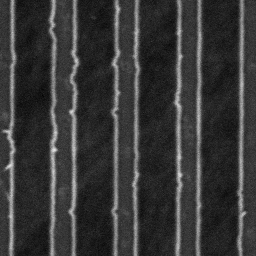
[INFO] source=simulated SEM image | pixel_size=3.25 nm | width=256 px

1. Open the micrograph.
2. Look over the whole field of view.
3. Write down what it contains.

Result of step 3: one or a few lines or trenches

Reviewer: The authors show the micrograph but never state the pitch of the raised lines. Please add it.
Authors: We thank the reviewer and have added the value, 0.203 microns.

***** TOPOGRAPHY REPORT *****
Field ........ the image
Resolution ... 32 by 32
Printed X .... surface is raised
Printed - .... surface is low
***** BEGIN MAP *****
-XXXXXX--XXXXXX--XXXXXX--XXXXX--
-XXXXXX--XXXXXX--XXXXXX--XXXXX--
-XXXXX---XXXXXX--XXXXX---XXXXX--
-XXXXX---XXXXXX--XXXXX---XXXXX--
--XXXXX--XXXXXX--XXXXX---XXXXX--
-XXXXXX--XXXXXX--XXXXX---XXXXX--
-XXXXXX--XXXXXX--XXXXX---XXXXX--
--XXXXX--XXXXXX--XXXXXX--XXXXX--
-XXXXXX--XXXXXX--XXXXX---XXXXX--
-XXXXXX--XXXXXX--XXXXX---XXXXX--
-XXXXXX--XXXXXX--XXXXX---XXXXX--
-XXXXXX--XXXXXX--XXXXX---XXXXX--
-XXXXXX--XXXXXX--XXXXX---XXXXX--
--XXXXX--XXXXX---XXXXX---XXXXX--
--XXXXX--XXXXX---XXXXX---XXXXX--
-XXXXXX--XXXXX---XXXXX---XXXXX--
-XXXXXX--XXXXXX--XXXXX---XXXXX--
-XXXXXX--XXXXXX--XXXXX---XXXXX--
--XXXXX--XXXXX---XXXXX---XXXXX--
-XXXXXX--XXXXX---XXXXXX--XXXXX--
-XXXXXX--XXXXX---XXXXX---XXXXX--
-XXXXXX--XXXXXX--XXXXXX--XXXXX--
-XXXXXX--XXXXXX--XXXXXX--XXXXX--
--XXXXX--XXXXX---XXXXXX--XXXXX--
-XXXXXX--XXXXXX--XXXXX---XXXXX--
-XXXXXX--XXXXXX--XXXXX---XXXXX--
-XXXXXX--XXXXX---XXXXX---XXXXX--
-XXXXXX--XXXXX---XXXXX---XXXXX--
-XXXXXX--XXXXXX--XXXXX---XXXXX--
-XXXXX---XXXXXX--XXXXX---XXXXX--
-XXXXX---XXXXX---XXXXX---XXXXX--
-XXXXXX--XXXXX---XXXXX---XXXXX--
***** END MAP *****